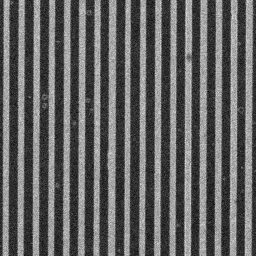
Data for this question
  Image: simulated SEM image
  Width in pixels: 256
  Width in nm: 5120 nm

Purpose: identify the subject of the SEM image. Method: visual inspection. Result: parallel lines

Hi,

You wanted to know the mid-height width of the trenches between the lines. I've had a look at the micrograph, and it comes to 0.19 micrometres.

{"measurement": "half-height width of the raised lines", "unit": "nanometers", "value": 110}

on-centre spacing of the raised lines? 303 nanometers